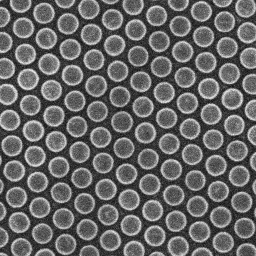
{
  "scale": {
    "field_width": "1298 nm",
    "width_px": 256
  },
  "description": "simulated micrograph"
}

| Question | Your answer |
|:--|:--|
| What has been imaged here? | a regular array of raised bodies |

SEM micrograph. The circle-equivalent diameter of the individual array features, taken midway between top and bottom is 102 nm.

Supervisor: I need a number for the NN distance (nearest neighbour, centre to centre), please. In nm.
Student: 129